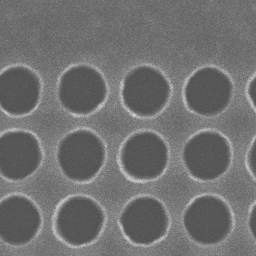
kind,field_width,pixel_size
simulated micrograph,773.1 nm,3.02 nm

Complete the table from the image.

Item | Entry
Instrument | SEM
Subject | a regular array of holes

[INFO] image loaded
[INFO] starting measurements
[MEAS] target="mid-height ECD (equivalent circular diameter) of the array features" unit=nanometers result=140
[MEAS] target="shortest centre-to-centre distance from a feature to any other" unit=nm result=191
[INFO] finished